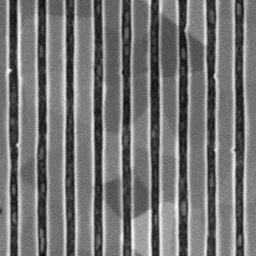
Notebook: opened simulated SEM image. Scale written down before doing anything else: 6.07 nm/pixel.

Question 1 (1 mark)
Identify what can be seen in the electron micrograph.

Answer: parallel lines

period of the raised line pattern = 0.171 µm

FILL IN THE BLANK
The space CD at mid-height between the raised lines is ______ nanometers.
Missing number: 58.4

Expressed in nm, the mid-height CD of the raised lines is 116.